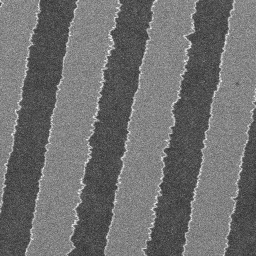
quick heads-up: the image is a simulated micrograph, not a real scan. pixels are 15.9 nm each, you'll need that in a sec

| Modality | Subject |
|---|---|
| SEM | one or a few lines or trenches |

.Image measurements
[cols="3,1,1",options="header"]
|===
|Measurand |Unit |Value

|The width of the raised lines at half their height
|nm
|575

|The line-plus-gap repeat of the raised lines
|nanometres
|1220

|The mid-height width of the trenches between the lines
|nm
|642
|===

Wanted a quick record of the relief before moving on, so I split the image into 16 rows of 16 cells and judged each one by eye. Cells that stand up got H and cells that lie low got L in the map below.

LLHHHLLHHHLLHHHL
LLHHLLLHHLLLHHLL
LLHHLLLHHLLLHHLL
LLHHLLLHHLLLHHLL
LLHHLLHHHLLHHHLL
LHHHLLHHHLLHHHLL
LHHLLLHHLLLHHLLL
LHHLLLHHLLLHHLLL
LHHLLLHHLLLHHLLH
LHHLLLHHLLHHHLLH
HHHLLHHHLLHHHLLH
HHHLLHHLLLHHLLLH
HHLLLHHLLLHHLLLH
HHLLLHHLLLHHLLHH
HHLLLHHLLHHHLLHH
HHLLHHHLLHHHLLHH